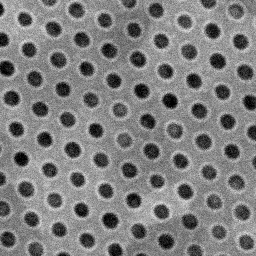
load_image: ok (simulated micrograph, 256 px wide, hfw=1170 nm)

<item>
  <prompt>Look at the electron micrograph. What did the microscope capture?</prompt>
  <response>a regular array of holes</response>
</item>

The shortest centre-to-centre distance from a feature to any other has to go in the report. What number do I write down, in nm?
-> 135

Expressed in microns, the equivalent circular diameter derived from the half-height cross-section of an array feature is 0.0815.